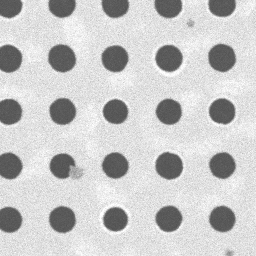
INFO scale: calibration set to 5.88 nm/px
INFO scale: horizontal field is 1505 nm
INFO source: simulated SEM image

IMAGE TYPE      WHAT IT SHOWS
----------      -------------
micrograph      a regular array of holes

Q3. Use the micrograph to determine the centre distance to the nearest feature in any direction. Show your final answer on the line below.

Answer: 312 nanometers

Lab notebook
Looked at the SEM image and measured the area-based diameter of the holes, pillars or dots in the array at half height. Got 154 nm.